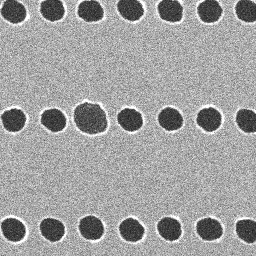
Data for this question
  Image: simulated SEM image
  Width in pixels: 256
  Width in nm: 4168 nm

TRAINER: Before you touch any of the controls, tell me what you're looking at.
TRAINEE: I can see a regular array of holes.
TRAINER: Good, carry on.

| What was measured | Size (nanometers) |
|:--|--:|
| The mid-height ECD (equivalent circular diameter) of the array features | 406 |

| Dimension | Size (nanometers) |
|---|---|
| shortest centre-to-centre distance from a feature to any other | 635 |